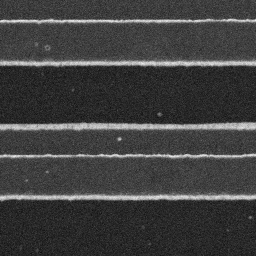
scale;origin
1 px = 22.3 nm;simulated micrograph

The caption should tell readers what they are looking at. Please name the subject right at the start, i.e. lines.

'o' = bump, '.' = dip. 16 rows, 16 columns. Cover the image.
oooooooooooooooo
oooooooooooooooo
oooooooooooooooo
oooooooooooooooo
................
................
................
................
oooooooooooooooo
oooooooooooooooo
oooooooooooooooo
oooooooooooooooo
................
................
................
................